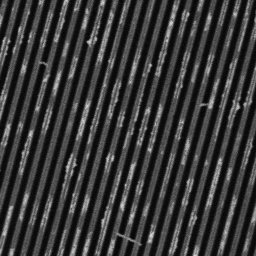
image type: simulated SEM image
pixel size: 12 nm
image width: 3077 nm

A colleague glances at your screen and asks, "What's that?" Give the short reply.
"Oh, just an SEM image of parallel lines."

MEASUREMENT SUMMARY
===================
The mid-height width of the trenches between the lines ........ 77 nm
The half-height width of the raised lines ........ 66.7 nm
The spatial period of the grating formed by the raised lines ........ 143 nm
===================